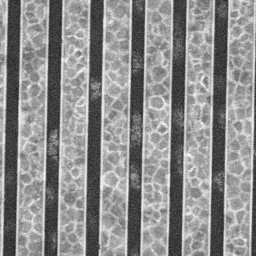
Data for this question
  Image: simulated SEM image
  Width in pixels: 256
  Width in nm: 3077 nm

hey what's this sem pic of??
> parallel lines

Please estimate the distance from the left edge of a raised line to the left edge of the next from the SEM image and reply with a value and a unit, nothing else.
41.4 px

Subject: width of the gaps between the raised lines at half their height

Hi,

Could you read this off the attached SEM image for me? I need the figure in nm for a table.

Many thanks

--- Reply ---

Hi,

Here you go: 182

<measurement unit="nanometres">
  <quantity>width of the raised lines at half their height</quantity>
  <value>321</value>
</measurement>